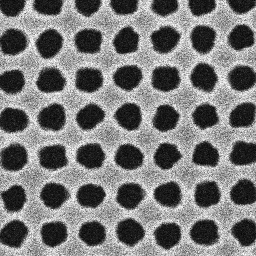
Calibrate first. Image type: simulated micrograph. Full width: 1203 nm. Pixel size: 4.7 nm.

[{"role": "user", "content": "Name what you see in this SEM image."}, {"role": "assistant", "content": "a regular array of holes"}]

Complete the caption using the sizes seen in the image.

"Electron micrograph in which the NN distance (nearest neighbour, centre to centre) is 175 nm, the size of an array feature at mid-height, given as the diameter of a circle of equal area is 125 nm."